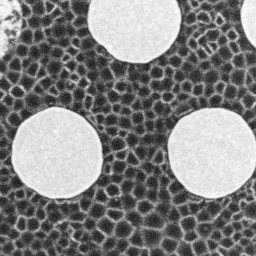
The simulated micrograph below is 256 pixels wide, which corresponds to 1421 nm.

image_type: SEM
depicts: raised bodies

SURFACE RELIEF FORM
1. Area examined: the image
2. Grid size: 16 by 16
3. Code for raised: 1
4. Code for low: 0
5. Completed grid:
0000001111100001
0000001111100001
0000001111100000
0000000111000000
0000000000000000
0000000000000000
0000000000000000
0011100000011110
0111110000011111
0111110000011111
0111110000011111
0011110000011110
0000000000000000
0000000000000000
0000000000000000
0000000000000000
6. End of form